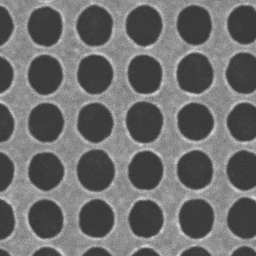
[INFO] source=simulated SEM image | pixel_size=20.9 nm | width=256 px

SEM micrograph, a regular array of holes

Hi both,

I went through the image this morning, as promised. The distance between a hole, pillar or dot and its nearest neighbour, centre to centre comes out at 1010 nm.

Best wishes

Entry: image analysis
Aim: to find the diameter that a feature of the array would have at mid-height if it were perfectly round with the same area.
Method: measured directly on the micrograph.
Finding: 807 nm